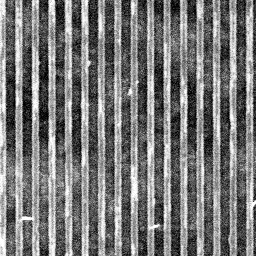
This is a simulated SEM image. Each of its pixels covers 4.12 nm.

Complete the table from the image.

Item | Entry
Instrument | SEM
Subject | parallel lines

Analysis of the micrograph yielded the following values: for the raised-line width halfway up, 24.2 nanometres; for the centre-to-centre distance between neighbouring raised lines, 67.9 nanometres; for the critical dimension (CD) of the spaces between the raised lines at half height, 44.8 nm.